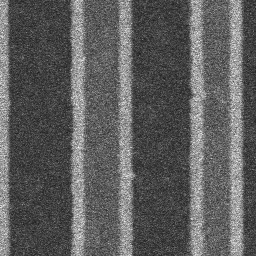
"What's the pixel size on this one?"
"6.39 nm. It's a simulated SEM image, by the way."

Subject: one or a few lines or trenches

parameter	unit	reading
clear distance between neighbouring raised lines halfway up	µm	0.469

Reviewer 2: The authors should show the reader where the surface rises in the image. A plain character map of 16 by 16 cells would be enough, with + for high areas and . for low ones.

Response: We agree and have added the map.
.....+++....+++.
.....+++....+++.
.....+++....+++.
.....+++....+++.
.....+++....+++.
.....+++....+++.
.....+++....+++.
.....+++....+++.
.....+++....+++.
.....+++....+++.
.....+++....+++.
.....+++....+++.
.....+++....+++.
.....+++....+++.
.....+++....+++.
.....+++....+++.